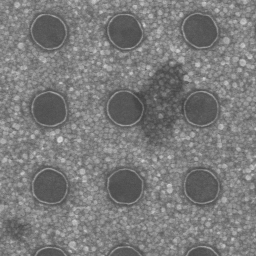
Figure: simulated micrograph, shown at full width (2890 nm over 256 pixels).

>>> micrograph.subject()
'a regular array of raised bodies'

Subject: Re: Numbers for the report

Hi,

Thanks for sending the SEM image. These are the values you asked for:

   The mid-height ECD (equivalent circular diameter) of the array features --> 0.396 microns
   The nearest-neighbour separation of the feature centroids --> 854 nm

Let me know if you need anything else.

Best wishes